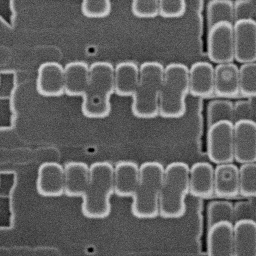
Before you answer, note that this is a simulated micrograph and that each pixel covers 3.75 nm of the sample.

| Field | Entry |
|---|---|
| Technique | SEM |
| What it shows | wiring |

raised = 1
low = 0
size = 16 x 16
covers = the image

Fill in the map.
0000011011100000
0000000000000001
0000000000000111
0000000000000111
0011111111111111
0011111111111111
0000011011110000
0000000000000000
0000000000000111
0000000000000111
0001111111111111
0011111111111111
0000011011110000
0000000001100000
0000000000000111
0000000000000111